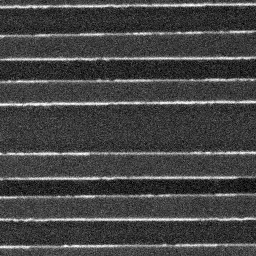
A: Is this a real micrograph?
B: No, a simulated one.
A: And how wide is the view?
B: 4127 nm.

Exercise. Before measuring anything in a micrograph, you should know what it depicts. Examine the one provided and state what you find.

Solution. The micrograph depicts lines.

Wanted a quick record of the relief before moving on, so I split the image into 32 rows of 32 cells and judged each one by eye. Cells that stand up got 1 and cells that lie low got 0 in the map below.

11111111111111111111111111111111
00000000000000000000000000000000
00000000000000000000000000000000
00000000000000000000000000000000
00001111111111111111111111111111
11111111111111111111111111111111
11111111111111111111111111111111
00000000000000000000000000000000
00000000000000000000000000000000
00000000000000000000000000000000
11111111111111111111111111111111
11111111111111111111111111111111
11111111111111111111111111111111
00000000000000000000000000000000
00000000000000000000000000000000
00000000000000000000000000000000
00000000000000000000000000000000
00000000000000000000000000000000
00000000000000000000000000000000
11111111111111111111111111111111
11111111111111111111111111111111
11111111111111111111111111111111
00000000000000000000000000000000
00000000000000000000000000000000
00000000000000000111111111111111
11111111111111111111111111111111
11111111111111111111111111111111
00000000000000000000000000000000
00000000000000000000000000000000
00000000000000000000000000000000
00000000000000000000000000000000
11111111111111111111111111111111